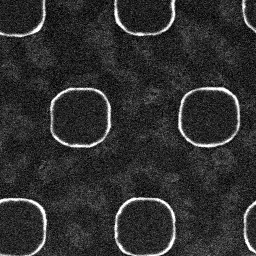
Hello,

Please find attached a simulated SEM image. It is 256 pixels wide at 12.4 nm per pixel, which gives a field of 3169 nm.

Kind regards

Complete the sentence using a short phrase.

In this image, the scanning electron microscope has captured raised bodies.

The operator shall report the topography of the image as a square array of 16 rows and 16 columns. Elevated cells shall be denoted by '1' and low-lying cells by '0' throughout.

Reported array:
1110000111100001
1110000111100000
0000000000000000
0000000000000000
0000000000000000
0000000000000100
0001111000011110
0001111000011110
0001111000001110
0000000000000000
0000000000000000
0000000000000000
1100000011000000
1110000111100001
1110000111100001
1100000011100000